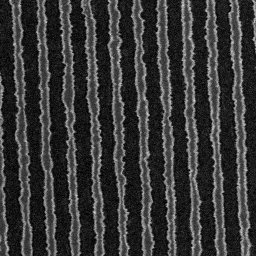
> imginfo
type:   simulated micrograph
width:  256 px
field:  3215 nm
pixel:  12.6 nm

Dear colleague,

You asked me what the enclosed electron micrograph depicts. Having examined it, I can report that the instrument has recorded parallel lines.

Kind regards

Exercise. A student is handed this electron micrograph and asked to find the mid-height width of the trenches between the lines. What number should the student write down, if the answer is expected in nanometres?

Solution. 216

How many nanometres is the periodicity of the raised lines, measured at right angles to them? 304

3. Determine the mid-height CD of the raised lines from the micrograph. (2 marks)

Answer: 0.0878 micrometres